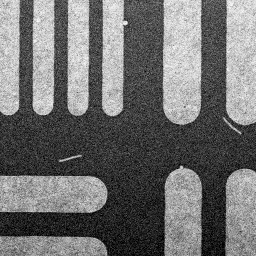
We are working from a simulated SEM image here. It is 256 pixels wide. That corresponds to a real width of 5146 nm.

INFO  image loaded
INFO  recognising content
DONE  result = groups of lines, slits or small figures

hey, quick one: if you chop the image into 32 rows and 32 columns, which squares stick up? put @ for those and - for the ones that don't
@@--@@@--@@--@@------@@@@---@@@@
@@--@@@--@@--@@------@@@@---@@@@
@@--@@@--@@--@@@-----@@@@---@@@@
@@--@@@--@@--@@------@@@@---@@@@
@@--@@@--@@--@@------@@@@---@@@@
@@--@@@--@@--@@------@@@@---@@@@
@@--@@@--@@--@@-----@@@@@---@@@@
@@--@@@--@@--@@-----@@@@@---@@@@
@@--@@@--@@--@@-----@@@@@----@@@
@@--@@@--@@--@@-----@@@@@---@@@@
@@--@@@--@@--@@-----@@@@@---@@@@
@@--@@@--@@--@@-----@@@@@---@@@@
@@--@@@--@@--@@-----@@@@@---@@@@
@@--@@---@@--@@-----@@@@@---@@@@
---------------------@@@@----@@@
------------------------------@-
--------------------------------
--------------------------------
--------------------------------
--------------------------------
--------------------------------
----------------------@@-----@@@
@@@@@@@@@@@@---------@@@@----@@@
@@@@@@@@@@@@@--------@@@@---@@@@
@@@@@@@@@@@@@--------@@@@---@@@@
@@@@@@@@@@@@@--------@@@@---@@@@
--------@-@----------@@@@---@@@@
---------------------@@@@---@@@@
---------------------@@@@---@@@@
---------------------@@@@---@@@@
@@@@@@@@@@@@@--------@@@@---@@@@
@@@@@@@@@@@@@--------@@@@---@@@@